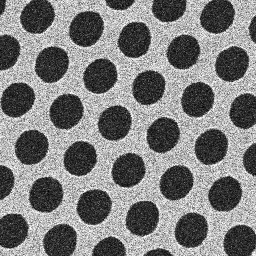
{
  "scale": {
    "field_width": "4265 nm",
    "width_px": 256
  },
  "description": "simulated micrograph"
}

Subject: a regular array of holes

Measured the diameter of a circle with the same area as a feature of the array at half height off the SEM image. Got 0.584 um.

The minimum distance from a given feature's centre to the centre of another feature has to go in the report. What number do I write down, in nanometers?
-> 820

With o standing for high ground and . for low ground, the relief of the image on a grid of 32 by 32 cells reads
.oo...ooooooo....oo....ooo...ooo
ooo....ooo..ooooooo....oo....ooo
ooo....oo....ooooooo..ooo....oo.
ooo...ooo....oo....oooooo....oo.
.oooooooo....oo....ooo..ooooooo.
..ooooooo...ooo....oo....ooooooo
...oo...ooooooo...ooo....ooo...o
..oo.....ooo..ooooooo....oo....o
.ooo....ooo....ooooooo..ooo....o
ooooo...oo.....oo...ooooooo...oo
o..ooooooo....ooo....ooo..oooooo
....ooooooo..ooo.....oo....ooooo
....ooo...ooooooo...ooo....oo...
....oo....ooo...ooooooo...ooo...
o..ooo....oo....oooooooo.oooo...
ooooooo...oo....ooo...ooooooo...
ooo..ooooooo....oo....oooo..oooo
oo....oooooooo.ooo....ooo...oooo
oo....ooo...ooooooo...oo.....oo.
oo....oo....ooo..oooooooo...oo..
ooo.oooo....oo....ooooooo..ooo..
..oooooo...ooo....ooo...ooooooo.
..ooo..ooooooo....oo....ooo...oo
..oo....oooooooooooo....oo....oo
.ooo....oo....oooooo...ooo....oo
oooo....oo....ooo..ooooooo....oo
ooooo.oooo....oo....oooooooooooo
...ooooooo...ooo....oo....oooooo
....oo...ooooooo....oo....ooo..o
...ooo....ooooooo.oooo....oo....
...oo.....oo...ooooooo...ooo....
oooooo...ooo....oo...ooooooo....